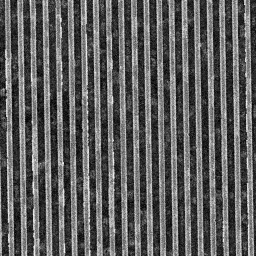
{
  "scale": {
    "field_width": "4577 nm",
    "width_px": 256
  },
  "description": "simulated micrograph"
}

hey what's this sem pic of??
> parallel lines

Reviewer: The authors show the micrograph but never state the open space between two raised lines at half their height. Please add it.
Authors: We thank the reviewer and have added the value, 145 nanometers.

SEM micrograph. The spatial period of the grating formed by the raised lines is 226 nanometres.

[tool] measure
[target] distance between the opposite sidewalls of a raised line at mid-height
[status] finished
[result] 73.7 nanometres